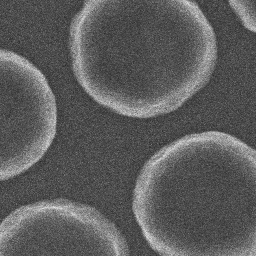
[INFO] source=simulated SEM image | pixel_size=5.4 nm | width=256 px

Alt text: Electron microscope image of raised bodies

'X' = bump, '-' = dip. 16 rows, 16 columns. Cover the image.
-----XXXXXXX---X
-----XXXXXXXX---
-----XXXXXXXX---
X----XXXXXXXX---
XX---XXXXXXXX---
XXX--XXXXXXX----
XXX----XXXX-----
XXX-------------
XXX-------------
XX--------XXXXXX
X--------XXXXXXX
---------XXXXXXX
---------XXXXXXX
-XXXXX---XXXXXXX
XXXXXXX--XXXXXXX
XXXXXXX---XXXXXX